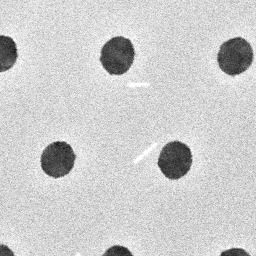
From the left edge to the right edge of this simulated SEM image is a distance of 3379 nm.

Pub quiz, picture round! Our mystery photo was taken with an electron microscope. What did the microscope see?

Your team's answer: holes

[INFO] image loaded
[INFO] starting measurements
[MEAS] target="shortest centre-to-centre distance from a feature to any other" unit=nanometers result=1550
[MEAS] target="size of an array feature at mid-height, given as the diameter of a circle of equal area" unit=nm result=498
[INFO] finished